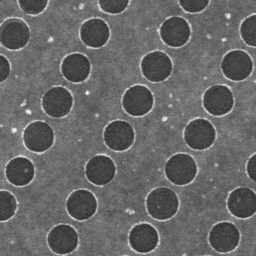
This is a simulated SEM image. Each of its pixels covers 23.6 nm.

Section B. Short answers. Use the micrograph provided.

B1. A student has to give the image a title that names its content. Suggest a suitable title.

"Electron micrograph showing a regular array of holes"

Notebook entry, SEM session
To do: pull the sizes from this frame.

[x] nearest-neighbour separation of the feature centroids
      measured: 923 nm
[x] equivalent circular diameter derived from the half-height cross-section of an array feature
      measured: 736 nm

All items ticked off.